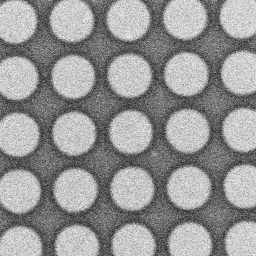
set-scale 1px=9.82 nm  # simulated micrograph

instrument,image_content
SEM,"an array of small figures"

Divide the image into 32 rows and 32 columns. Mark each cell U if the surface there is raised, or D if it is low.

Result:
UUUDDDDUUUUDDDUUUUDDDUUUUDDDUUUU
UUUUDDDUUUUDDDUUUUUDDUUUUUDDUUUU
UUUUDDUUUUUUDUUUUUUDDUUUUUDDUUUU
UUUUDDUUUUUDDDUUUUDDDUUUUDDDUUUU
UUUUDDDUUUUDDDUUUUDDDDUUDDDDDUUD
DDDDDDDDDDDDDDDDDDDDDDDDDDDDDDDD
DDDDDDDDDDDDDDDDDDDDDDDDDDDDDDUD
DUUDDDDDUUUDDDUUUUDDDUUUUDDDUUUU
UUUUDDDUUUUUDDUUUUUDDUUUUUDDUUUU
UUUUUDDUUUUUDDUUUUUDDUUUUUDDUUUU
UUUUUDDUUUUUDDUUUUUDDUUUUUDDUUUU
UUUUDDDUUUUDDDDUUUDDDDUUUDDDDUUU
DDDDDDDDDDDDDDDDDDDDDDDDDDDDDDDD
DDDDDDDDDDDDDDDDDDDDDDDDDDDDDDDD
DUUDDDDDUUUDDDDUUUDDDDUUUDDDDUUU
UUUUDDDUUUUUDDUUUUUDDUUUUUDDUUUU
UUUUUDDUUUUUDDUUUUUDDUUUUUDDUUUU
UUUUUDDUUUUUDDUUUUUDDUUUUUDDUUUU
UUUUDDDUUUUDDDDUUUDDDDUUUDDDDUUU
DDUDDDDDDDDDDDDDDDDDDDDDDDDDDDDD
DDDDDDDDDDDDDDDDDDDDDDDDDDDDDDDD
DUUDDDDDUUUDDDDUUUDDDDUUUDDDDUUU
UUUUUDDUUUUUDDUUUUUDDUUUUUDDUUUU
UUUUUDDUUUUUDDUUUUUDDUUUUUDDUUUU
UUUUUDDUUUUUDDUUUUUDDUUUUUDDUUUU
UUUUDDDUUUUDDDDUUUDDDDUUUDDDDUUU
DDUDDDDDDDDDDDDDDDDDDDDDDDDDDDDD
DDDDDDDDDDDDDDDDDDDDDDDDDDDDDDDD
DDUDDDDDUUUDDDDUUUDDDDUUUDDDDUUU
UUUUUDDUUUUUDDUUUUUDDUUUUUDDUUUU
UUUUUDDUUUUUDDUUUUUDDUUUUUDDUUUU
UUUUUDDUUUUUDDUUUUUDDUUUUUDDUUUU